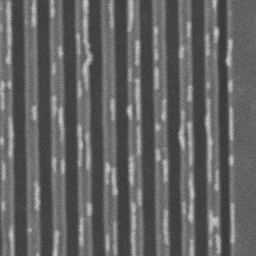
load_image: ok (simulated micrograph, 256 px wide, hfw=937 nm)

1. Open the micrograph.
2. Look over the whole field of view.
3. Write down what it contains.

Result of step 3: parallel lines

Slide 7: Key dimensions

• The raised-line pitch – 94.2 nm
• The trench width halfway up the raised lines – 13.9 pixels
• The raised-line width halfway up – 43.9 nm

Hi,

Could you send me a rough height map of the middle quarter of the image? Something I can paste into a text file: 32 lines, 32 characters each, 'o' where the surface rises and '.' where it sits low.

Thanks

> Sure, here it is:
....oo....ooo...ooo....oo....ooo
...ooo....ooo...ooo....oo....ooo
....oo....oo....ooo....oo....ooo
....oo....oo....ooo....oo....ooo
....oo....ooo...ooo....oo....ooo
....oo....ooo...ooo....oo....ooo
....oo....ooo...ooo....oo....ooo
....oo....ooo...ooo....oo....ooo
....oo....ooo...ooo....oo....ooo
....oo....ooo...ooo....oo....ooo
...ooo....ooo...ooo....oo....ooo
...ooo....ooo...ooo....oo....ooo
...ooo....ooo...ooo....oo....ooo
...ooo....ooo...ooo....ooo...ooo
....oo....ooo...ooo....ooo...ooo
....oo....ooo...ooo....ooo...ooo
....oo....ooo....oo....oo....ooo
....oo....ooo....oo....oo....ooo
....oo....ooo...ooo....ooo...ooo
....oo....ooo...ooo....ooo...ooo
....oo....ooo...ooo....ooo...ooo
....oo....ooo...ooo....ooo....oo
....oo....ooo....oo....ooo....oo
....oo....ooo...ooo....ooo....oo
....oo....ooo...ooo....ooo....oo
....oo....ooo...ooo....ooo....oo
....oo....ooo...ooo....ooo...ooo
....oo....ooo...ooo....ooo...ooo
....oo....ooo...ooo....ooo...ooo
....ooo...ooo...ooo....ooo...ooo
....ooo...ooo....oo....ooo...ooo
....ooo...ooo....oo....ooo....oo